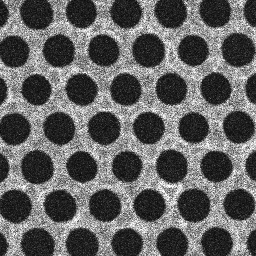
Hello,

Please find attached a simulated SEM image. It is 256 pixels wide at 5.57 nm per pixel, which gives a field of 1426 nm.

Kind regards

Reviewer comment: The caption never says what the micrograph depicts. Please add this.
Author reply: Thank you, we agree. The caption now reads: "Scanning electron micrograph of a regular array of holes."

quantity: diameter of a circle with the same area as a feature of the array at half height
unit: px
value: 32.3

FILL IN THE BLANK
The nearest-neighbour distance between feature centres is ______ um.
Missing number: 0.248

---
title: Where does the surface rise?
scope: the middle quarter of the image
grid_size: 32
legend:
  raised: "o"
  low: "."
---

.oooooooo..ooooooooo...ooooooooo
oooooooooooooooooooooooooooooooo
ooo...oooooooo...oooooooo...oooo
oo.....oooooo.....oooooo.....ooo
o.......oooo.......oooo.......oo
........oooo.......oooo........o
.........oo.........ooo........o
o.......oooo.......oooo........o
o.......oooo.......ooooo......oo
oo.....oooooo.....ooooooo....ooo
oooo.ooooooooooooooooooooooooooo
oooooooooooooooooooooooooooooooo
oooooooo....ooooooo....oooooooo.
..ooooo......ooooo......ooooo...
..oooo........ooo........oooo...
...ooo........ooo........ooo....
...ooo........ooo........ooo....
...ooo........oooo.......oooo...
..ooooo.......oooo......ooooo...
.ooooooo.....oooooo....oooooooo.
oooooooooooooooooooooooooooooooo
oooooooooooooooooooooooooo..oooo
oo.....oooooo.....oooooo......oo
o.......oooo.......oooo.......oo
o.......oooo.......oooo........o
........oooo........ooo........o
o........ooo........ooo........o
o.......oooo.......oooo........o
oo......ooooo......ooooo......oo
ooo...ooooooooo...oooooooo...ooo
oooooooooooooooooooooooooooooooo
ooooooooo..ooooooooo...oooooooo.